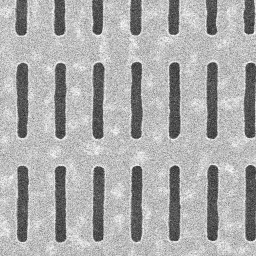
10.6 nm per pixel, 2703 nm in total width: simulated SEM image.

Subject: a regular array of holes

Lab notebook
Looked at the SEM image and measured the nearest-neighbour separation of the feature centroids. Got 399 nm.